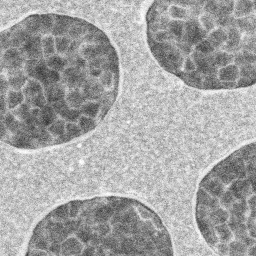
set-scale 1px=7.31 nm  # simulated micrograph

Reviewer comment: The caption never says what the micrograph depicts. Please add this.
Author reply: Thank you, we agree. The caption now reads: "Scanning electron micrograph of holes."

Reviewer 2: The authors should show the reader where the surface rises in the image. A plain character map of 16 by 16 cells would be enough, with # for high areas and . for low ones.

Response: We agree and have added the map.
#########.......
#.....###.......
.......##.......
.......###......
.......####.....
.......#####...#
.......#########
......##########
.....###########
###############.
#############...
############....
#####....###....
###.......##....
##........###...
##.........##...